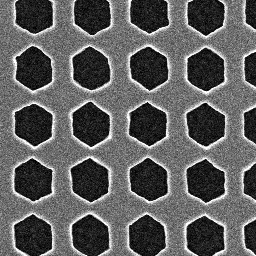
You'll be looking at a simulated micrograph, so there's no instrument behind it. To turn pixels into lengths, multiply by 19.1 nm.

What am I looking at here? a regular array of holes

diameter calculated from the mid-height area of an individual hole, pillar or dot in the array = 760 nm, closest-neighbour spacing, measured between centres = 1060 nm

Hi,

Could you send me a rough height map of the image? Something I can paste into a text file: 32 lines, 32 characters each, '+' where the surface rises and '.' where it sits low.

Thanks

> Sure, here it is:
++.....++.....++.....+++....+++.
++.....++.....++.....++.....+++.
++.....++.....++.....++.....+++.
+++...++++...++++...++++...+++++
++++++++++++++++++++++++++++++++
++++++++++++++++++++++++++++++++
+++..+++++...++++...+++++..+++++
++....+++....+++.....++.....+++.
++.....++.....++.....++.....++..
++.....++.....++.....++.....+++.
+++...++++...++++...++++....+++.
++++++++++++++++++++++++++++++++
++++++++++++++++++++++++++++++++
+++..+++++..+++++...++++...+++++
++.....++.....++.....++.....++..
++.....++.....++.....++.....++..
++.....++.....++.....+++....++..
+++...++++...++++...++++...++++.
++++++++++++++++++++++++++++++++
++++++++++++++++++++++++++++++++
+++..+++++...++++...++++..++++++
++.....++.....++.....++.....+++.
++....+++.....++.....++.....++..
++....+++.....++.....++.....++..
+++...++++...++++...++++....+++.
++++++++++++++++++++++++++++++++
++++++++++++++++++++++++++++++++
+++..+++++..+++++..+++++..++++++
++....+++....+++.....++.....+++.
++.....++.....++.....++.....++..
++.....++.....++.....++.....+++.
+++...++++...++++...++++...+++++